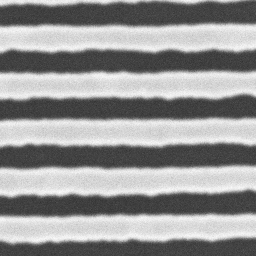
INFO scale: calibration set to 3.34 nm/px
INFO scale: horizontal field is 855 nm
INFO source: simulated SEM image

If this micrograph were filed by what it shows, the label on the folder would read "lines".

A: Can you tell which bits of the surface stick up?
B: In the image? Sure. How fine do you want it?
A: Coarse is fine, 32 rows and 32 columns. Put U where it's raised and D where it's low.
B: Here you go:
UDDDDDUDDDDDDDDDDDDDDDDDDDDDDDDD
DDDDDDDDDDDDDDDDDDDDDDDDDDDDDDDD
DDDDDDDDDDDDDDDDDDDDDDDDDDDDDDDD
UUUUUUUUUUUUUUUUUUUUUUUUUUUUUUUU
UUUUUUUUUUUUUUUUUUUUUUUUUUUUUUUU
UUUUUUUUUUUUUUUUUUUUUUUUUUUUUUUU
DDDDDDDDDDDDDDDDDDDDDDDDDDDDDDDD
DDDDDDDDDDDDDDDDDDDDDDDDDDDDDDDD
DDDDDDDDDDDDDDDDDDDDDDDDDDDDDDDD
UUUUUUUUUUUUUUUUUUUUUUUUUUUUUUUU
UUUUUUUUUUUUUUUUUUUUUUUUUUUUUUUU
UUUUUUUUUUUUUUUUUUUUUUUUUUUUUUUU
DDDDDDDDDDDDDDDDDDDDDDDDDDDDDDDD
DDDDDDDDDDDDDDDDDDDDDDDDDDDDDDDD
DDDDDDDDDDDDDDDDDDDDDDDDDDDDDDDD
UUUUUUUUUUUUUUUUUUUUUUUUUUUUUUUU
UUUUUUUUUUUUUUUUUUUUUUUUUUUUUUUU
UUUUUUUUUUUUUUUUUUUUUUUUUUUUUUUU
DDDDDDDDDDDDDDDDDDDDDDDDDDDDDDDD
DDDDDDDDDDDDDDDDDDDDDDDDDDDDDDDD
DDDDDDDDDDDDDDDDDDDDDDDDDDDDDDDD
UUUUUUUUUUUUUUUUUUUUUUUUUUUUUUUU
UUUUUUUUUUUUUUUUUUUUUUUUUUUUUUUU
UUUUUUUUUUUUUUUUUUUUUUUUUUUUUUUU
DUDDDDDDDDDDDDDDDDDDDDDDDDDDDDDD
DDDDDDDDDDDDDDDDDDDDDDDDDDDDDDDD
DDDDDDDDDDDDDDDDDDDDDDDDDDDDDDDD
UUUUUUUUUUUUUUUUUUUUUUUUUUUUUUUU
UUUUUUUUUUUUUUUUUUUUUUUUUUUUUUUU
UUUUUUUUUUUUUUUUUUUUUUUUUUUUUUUU
DDDDDDDDDDDDDDDDDDDDDDDDDDDDDDDD
DDDDDDDDDDDDDDDDDDDDDDDDDDDDDDDD